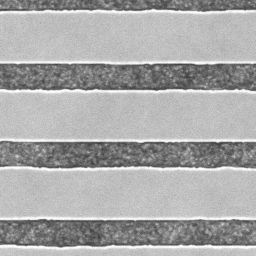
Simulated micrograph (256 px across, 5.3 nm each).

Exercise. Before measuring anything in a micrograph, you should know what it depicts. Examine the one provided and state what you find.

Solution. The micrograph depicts lines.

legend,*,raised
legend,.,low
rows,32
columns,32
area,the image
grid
................................
********************************
********************************
********************************
********************************
********************************
********************************
********************************
................................
................................
................................
********************************
********************************
********************************
********************************
********************************
********************************
********************************
................................
................................
................................
********************************
********************************
********************************
********************************
********************************
********************************
................*...............
................................
................................
................................
********************************